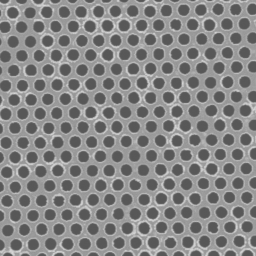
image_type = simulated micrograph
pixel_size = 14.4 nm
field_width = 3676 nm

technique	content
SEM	a regular array of holes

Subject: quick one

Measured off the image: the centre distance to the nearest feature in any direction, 16.4 px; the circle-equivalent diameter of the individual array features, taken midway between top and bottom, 163 nanometers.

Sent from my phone